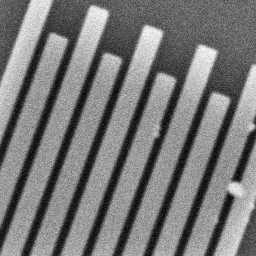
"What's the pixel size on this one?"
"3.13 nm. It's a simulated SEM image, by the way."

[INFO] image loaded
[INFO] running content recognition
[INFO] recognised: groups of lines, slits or small figures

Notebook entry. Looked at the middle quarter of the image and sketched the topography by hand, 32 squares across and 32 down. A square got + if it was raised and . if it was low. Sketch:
.+++++...+++++..++++++..........
.+++++..++++++..+++++..........+
++++++..+++++...+++++...+......+
+++++...+++++..++++++..++++....+
+++++..++++++..+++++...+++++..++
+++++..+++++...+++++..++++++..++
++++...+++++..++++++..+++++...++
++++..+++++...+++++..++++++..+++
+++...+++++..++++++..+++++...+++
+++..++++++..+++++...+++++...+++
+++..+++++...+++++...+++++..++++
++...+++++...+++++..+++++...++++
++...+++++..+++++...+++++...++++
++..+++++...+++++...+++++..+++++
+...+++++...+++++..+++++...+++++
+..+++++...+++++...+++++..+++++.
...+++++...+++++..++++++..+++++.
...+++++..+++++...++++++..+++++.
..+++++...+++++...+++++..+++++..
..+++++...+++++..+++++...+++++..
..+++++..+++++...+++++...+++++..
.+++++...+++++...+++++..+++++...
.+++++...+++++..+++++...+++++..+
+++++...+++++...+++++..++++++..+
+++++...+++++..++++++..+++++...+
+++++..++++++..+++++...+++++..++
+++++..+++++...+++++..++++++..++
++++...+++++..++++++..+++++...++
++++..++++++..+++++...+++++..+++
++++..+++++...+++++..+++++...+++
+++...+++++..+++++...+++++...+++
+++..+++++...+++++...+++++..++++